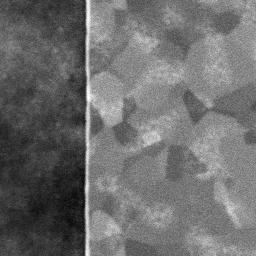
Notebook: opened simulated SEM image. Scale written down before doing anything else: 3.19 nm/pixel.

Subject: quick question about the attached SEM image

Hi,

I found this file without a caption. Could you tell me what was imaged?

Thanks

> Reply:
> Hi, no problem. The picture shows one or a few lines or trenches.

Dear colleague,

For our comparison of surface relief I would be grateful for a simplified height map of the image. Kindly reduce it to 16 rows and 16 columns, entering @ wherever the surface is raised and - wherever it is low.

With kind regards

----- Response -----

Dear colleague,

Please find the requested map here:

-----@@@@@@@@@@@
-----@@@@@@@@@@@
-----@@@@@@@@@@@
-----@@@@@@@@@@@
-----@@@@@@@@@@@
-----@@@@@@@@@@@
------@@@@@@@@@@
-----@@@@@@@@@@@
-----@@@@@@@@@@@
-----@@@@@@@@@@@
-----@@@@@@@@@@@
-----@@@@@@@@@@@
-----@@@@@@@@@@@
-----@@@@@@@@@@@
-----@@@@@@@@@@@
-----@@@@@@@@@@@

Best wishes